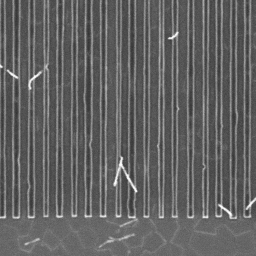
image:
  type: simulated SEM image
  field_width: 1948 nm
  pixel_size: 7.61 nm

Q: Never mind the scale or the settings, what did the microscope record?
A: parallel lines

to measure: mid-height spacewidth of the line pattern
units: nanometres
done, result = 64.6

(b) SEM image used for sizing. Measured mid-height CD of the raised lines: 45.6 nanometres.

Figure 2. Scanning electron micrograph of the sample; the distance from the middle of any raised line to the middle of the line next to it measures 0.11 µm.